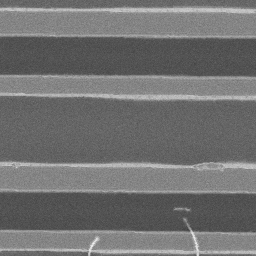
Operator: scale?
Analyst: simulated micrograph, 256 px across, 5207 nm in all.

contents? lines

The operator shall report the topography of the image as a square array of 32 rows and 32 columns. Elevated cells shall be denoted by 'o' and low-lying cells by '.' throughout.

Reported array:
................................
oooooooooooooooooooooooo........
oooooooooooooooooooooooooooooooo
oooooooooooooooooooooooooooooooo
...................ooooooooooooo
................................
................................
................................
................................
................................
oooooooooooooooooooooooooooooooo
oooooooooooooooooooooooooooooooo
................................
................................
................................
................................
................................
................................
................................
................................
.o.......................ooo....
oooooooooooooooooooooooooooooooo
oooooooooooooooooooooooooooooooo
oooooooooooooooooooooooooooooooo
................................
................................
................................
................................
................................
oooooooooooooooooooooooooooooooo
oooooooooooooooooooooooooooooooo
........................o.......